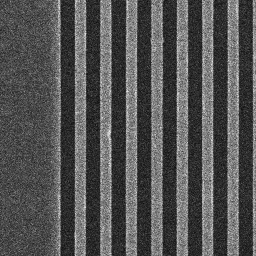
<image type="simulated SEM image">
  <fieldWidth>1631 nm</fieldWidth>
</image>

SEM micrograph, parallel lines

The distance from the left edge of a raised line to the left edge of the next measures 162 nanometers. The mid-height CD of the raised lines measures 69.3 nanometers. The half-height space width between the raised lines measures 14.4 pixels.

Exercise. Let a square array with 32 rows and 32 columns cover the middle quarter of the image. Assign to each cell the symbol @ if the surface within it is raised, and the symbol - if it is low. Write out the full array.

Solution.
---@@----@@@----@@----@@@---@@@-
---@@----@@@----@@----@@@---@@@-
---@@----@@@----@@----@@@---@@@-
---@@----@@@----@@----@@@---@@@-
---@@----@@@----@@----@@@---@@@-
---@@----@@@----@@----@@@---@@@-
---@@----@@@----@@----@@@---@@@-
---@@----@@@----@@----@@@---@@@-
---@@----@@@----@@----@@@---@@@-
---@@----@@@----@@----@@@---@@@-
---@@----@@@----@@----@@----@@@-
---@@----@@@----@@----@@----@@@-
---@@----@@@----@@----@@----@@@-
---@@----@@@----@@----@@----@@@-
---@@----@@@----@@----@@----@@@-
---@@----@@@----@@----@@----@@@-
---@@----@@@----@@----@@----@@@-
---@@----@@@----@@----@@----@@@-
---@@----@@@----@@----@@----@@@-
---@@----@@@----@@----@@----@@@-
---@@----@@@----@@----@@----@@@-
---@@----@@@----@@----@@----@@@-
---@@----@@@----@@----@@----@@@-
---@@----@@@----@@----@@----@@@-
---@@----@@@----@@----@@----@@@-
---@@----@@@----@@----@@----@@@-
---@@----@@@----@@----@@----@@@-
---@@----@@@----@@----@@----@@@-
---@@----@@@----@@----@@----@@@-
---@@----@@@----@@----@@----@@@-
---@@----@@@----@@----@@----@@@-
---@@----@@@----@@----@@----@@@-